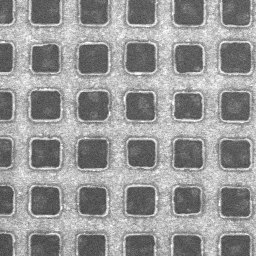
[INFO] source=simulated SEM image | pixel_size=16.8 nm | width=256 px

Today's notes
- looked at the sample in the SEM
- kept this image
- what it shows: a regular array of raised bodies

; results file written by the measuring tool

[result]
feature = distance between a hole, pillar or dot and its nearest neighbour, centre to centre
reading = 788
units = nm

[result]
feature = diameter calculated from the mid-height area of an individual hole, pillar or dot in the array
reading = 0.565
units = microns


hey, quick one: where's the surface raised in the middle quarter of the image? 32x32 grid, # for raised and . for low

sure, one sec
....#######....########.....####
....#######.....#######.....####
.....##.........................
................................
................................
................................
................................
....#######.....######......####
....#######.....#######.....####
....#######.....#######.....####
....#######.....#######.....####
....#######.....#######.....####
....#######.....#######....#####
....#######.....#######.....####
................................
................................
................................
................................
................................
....#######.....#######....#####
...########.....#######....#####
...########.....#######....#####
...########.....#######.....####
...########.....#######....#####
...########.....#######....#####
...########......#####......####
................................
................................
................................
................................
................#...#...........
....#######....########....#####